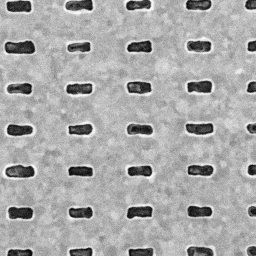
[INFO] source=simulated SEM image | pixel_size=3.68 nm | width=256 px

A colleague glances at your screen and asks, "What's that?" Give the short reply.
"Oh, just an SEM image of a regular array of holes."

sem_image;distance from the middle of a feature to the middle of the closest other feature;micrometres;0.152